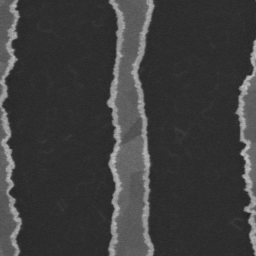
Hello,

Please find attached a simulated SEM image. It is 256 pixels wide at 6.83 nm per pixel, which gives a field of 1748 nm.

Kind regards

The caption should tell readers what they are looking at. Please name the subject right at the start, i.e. one or a few lines or trenches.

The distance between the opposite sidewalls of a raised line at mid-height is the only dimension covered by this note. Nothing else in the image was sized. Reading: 214 nanometers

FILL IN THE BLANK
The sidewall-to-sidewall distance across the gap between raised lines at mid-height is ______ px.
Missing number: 104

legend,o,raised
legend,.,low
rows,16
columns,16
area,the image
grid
o......oo.......
o......oo.......
o......oo.......
o......oo.......
.......oo.......
.......oo......o
.......oo......o
.......oo......o
.......oo......o
o......oo......o
o......oo......o
o......oo......o
o......oo.......
o......oo.......
o......oo.......
o......oo.......